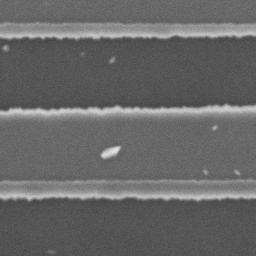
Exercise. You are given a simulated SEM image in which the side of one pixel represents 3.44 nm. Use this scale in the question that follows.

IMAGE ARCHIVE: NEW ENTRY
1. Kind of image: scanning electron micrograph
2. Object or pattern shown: lines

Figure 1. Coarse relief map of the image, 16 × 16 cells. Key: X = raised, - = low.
XXXXXXXXXXXXXXXX
XXXXXXXXXXXXXXXX
----------------
----------------
----------------
----------------
----------------
XXXXXXXXXXXXXXXX
XXXXXXXXXXXXXXXX
XXXXXXXXXXXXXXXX
XXXXXXXXXXXXXXXX
XXXXXXXXXXXXXXXX
----------------
----------------
----------------
----------------